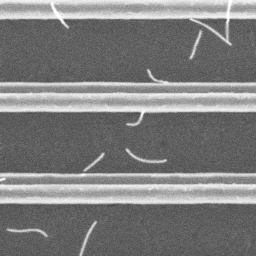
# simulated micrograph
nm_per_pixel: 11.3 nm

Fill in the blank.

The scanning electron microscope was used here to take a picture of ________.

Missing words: lines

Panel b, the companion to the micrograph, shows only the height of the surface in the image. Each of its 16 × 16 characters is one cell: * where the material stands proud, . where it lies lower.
****************
................
................
................
................
****************
****************
................
................
................
................
****************
****************
................
................
................